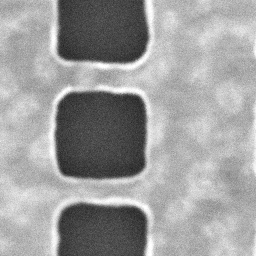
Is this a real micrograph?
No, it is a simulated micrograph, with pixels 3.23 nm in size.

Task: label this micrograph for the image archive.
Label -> holes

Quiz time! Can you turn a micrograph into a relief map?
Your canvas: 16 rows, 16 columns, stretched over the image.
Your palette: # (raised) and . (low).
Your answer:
####.....#######
###......#######
####.....#######
####.....#######
################
################
####.....#######
###......#######
###......#######
###......#######
####.....#######
################
################
####.....#######
####.....#######
###......#######